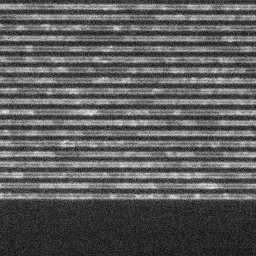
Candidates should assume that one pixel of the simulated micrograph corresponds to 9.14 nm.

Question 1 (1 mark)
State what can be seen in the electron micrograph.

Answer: parallel lines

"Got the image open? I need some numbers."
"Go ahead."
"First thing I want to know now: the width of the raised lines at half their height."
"38.8 nm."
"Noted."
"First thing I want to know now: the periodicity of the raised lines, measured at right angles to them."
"96 nm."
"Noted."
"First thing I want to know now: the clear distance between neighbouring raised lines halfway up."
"0.0617 micrometres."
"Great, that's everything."